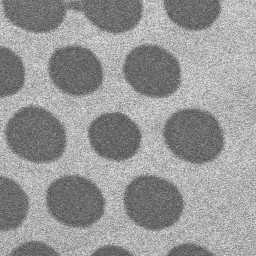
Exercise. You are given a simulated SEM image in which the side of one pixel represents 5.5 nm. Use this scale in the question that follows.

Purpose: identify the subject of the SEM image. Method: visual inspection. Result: holes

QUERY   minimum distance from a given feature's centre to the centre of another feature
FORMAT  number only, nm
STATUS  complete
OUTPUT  417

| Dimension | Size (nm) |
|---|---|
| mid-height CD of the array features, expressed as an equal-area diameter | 309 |